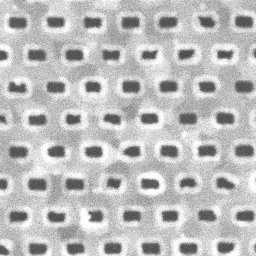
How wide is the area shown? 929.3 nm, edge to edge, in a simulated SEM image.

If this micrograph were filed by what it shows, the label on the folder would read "a regular array of holes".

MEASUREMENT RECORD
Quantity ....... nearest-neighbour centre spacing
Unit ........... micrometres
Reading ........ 0.133